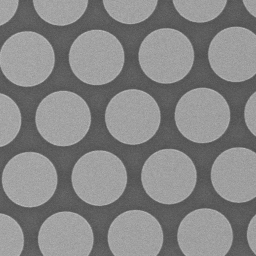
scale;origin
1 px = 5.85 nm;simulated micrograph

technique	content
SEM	an array of small figures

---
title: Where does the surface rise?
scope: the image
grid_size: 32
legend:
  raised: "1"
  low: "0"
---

11001111111001111111001111110001
11000111111001111110001111110001
10000011110000011100000011000000
00000000000000000000000000000100
01111000001111000011111000011111
01111100011111100011111100111111
11111110011111100111111100111111
11111110011111100111111100111111
11111110011111100011111100011111
01111100001111100011111000011111
00111000000110000000000000000000
00000001100000011100000011100000
11000111110000111110001111110001
11000111111001111111001111111001
11101111111001111111001111111001
11100111111001111111001111111001
11000111111000111110000111110001
11000011110000011100000011100000
00000000000000000000000000000100
00111000001111000001111000011111
01111100011111100011111100011111
11111110011111110011111100111111
11111110011111110011111100111111
11111110011111110011111100011111
01111100001111100001111000001111
00111000000110000000000000000000
00000000000000001100000011100000
11000011111000111111000111110001
11100111111000111111001111111001
11100111111100111111001111111001
11100111111100111111001111111001
11100111111000111111000111110000